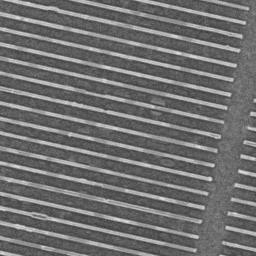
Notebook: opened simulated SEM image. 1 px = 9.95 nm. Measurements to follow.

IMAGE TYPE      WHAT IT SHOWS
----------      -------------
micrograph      parallel lines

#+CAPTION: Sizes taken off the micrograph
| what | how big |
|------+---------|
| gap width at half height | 0.118 microns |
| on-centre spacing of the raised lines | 145 nanometres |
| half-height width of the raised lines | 27.9 nm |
